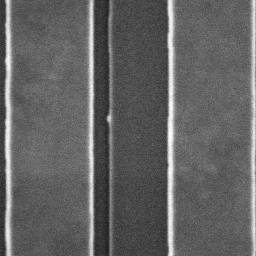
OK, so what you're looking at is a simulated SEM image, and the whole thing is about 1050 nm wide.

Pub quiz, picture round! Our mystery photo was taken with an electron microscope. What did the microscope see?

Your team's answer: lines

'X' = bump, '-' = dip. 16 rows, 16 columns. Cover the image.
XXXXXX-----XXXXX
XXXXXX-----XXXXX
XXXXXX-----XXXXX
XXXXXX-----XXXXX
XXXXXX-----XXXXX
XXXXXX-----XXXXX
XXXXXX-----XXXXX
XXXXXX-----XXXXX
XXXXXX-----XXXXX
XXXXXX-----XXXXX
XXXXXX-----XXXXX
XXXXXX-----XXXXX
XXXXXX-----XXXXX
XXXXXX-----XXXXX
XXXXXX-----XXXXX
XXXXXX-----XXXXX